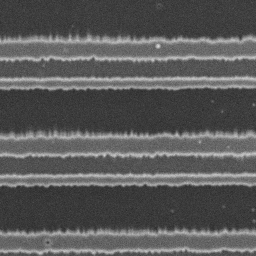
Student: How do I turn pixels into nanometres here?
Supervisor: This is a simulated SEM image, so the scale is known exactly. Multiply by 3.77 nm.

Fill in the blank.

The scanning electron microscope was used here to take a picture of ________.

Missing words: lines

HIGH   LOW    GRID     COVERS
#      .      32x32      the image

................................
................................
................................
................................
................................
################################
################################
################################
################################
################################
################################
................................
................................
................................
................................
................................
................................
################################
################################
################################
################################
################################
################################
................................
................................
................................
................................
................................
................................
################################
################################
################################